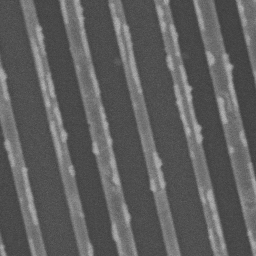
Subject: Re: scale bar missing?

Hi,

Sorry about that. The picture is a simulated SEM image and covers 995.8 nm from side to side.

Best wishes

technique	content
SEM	parallel lines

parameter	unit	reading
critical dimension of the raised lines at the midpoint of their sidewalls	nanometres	55.3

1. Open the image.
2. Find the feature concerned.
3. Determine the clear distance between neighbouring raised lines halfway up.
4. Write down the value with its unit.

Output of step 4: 28.5 pixels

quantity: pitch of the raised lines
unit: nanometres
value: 169